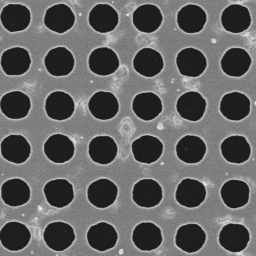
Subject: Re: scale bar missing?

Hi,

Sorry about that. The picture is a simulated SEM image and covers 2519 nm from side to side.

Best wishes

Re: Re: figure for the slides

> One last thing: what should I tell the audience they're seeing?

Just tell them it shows a regular array of holes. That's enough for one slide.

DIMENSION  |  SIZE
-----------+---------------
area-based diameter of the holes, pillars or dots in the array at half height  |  287 nm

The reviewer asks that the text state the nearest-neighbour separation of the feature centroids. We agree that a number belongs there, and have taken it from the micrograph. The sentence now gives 425 nm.